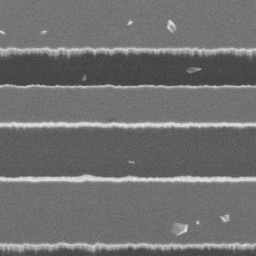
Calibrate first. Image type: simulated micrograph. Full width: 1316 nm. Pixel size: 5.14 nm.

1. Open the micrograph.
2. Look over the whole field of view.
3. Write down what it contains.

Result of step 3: lines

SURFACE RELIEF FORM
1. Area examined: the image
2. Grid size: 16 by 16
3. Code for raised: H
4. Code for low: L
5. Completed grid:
HHHHHHHHHHHHHHHH
HHHHHHHHHHHHHHHH
HHHHHHHHHHHHHHHH
LLLLLLLLLLLLLLLL
LLLLLLLLLLLLLLLL
HHHHHHHHHHHHHHHH
HHHHHHHHHHHHHHHH
HHHHHHHHHHHHHHHH
LLLLLLLLLLLLLLLL
LLLLLLLLLLLLLLLL
LLLLLLLLLLLLLLLL
HHHHHHHHHHHHHHHH
HHHHHHHHHHHHHHHH
HHHHHHHHHHHHHHHH
HHHHHHHHHHHHHHHH
LLLLLLLLLLLLLLLL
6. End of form